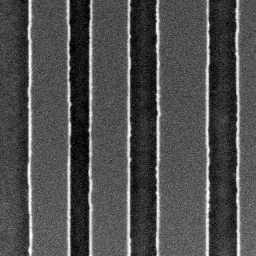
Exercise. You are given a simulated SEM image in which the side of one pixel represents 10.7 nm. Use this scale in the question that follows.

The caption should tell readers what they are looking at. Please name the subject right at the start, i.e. lines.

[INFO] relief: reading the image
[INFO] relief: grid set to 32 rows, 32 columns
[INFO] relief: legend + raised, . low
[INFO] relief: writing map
....+++++..+++++....++++++....++
....+++++..+++++....++++++....++
....+++++..+++++....++++++....++
....+++++..+++++....++++++....++
....+++++..+++++....++++++....++
....+++++..+++++....++++++....++
....+++++..+++++....++++++....++
....+++++..+++++....++++++....++
....+++++..+++++....++++++....++
....+++++..+++++....++++++....++
....+++++..+++++....++++++....++
....+++++..+++++....++++++....++
....+++++..+++++....++++++....++
....+++++..+++++....++++++....++
....+++++..+++++....++++++....++
....+++++..+++++....++++++....++
....+++++..+++++....++++++....++
....+++++..+++++....++++++....++
....+++++..+++++....++++++....++
....+++++..+++++....++++++....++
....+++++..+++++....++++++....++
....+++++..+++++....++++++....++
....+++++..+++++....++++++....++
....+++++..+++++....++++++....++
....+++++..+++++....++++++....++
....+++++..+++++....++++++....++
....+++++..+++++....++++++....++
....+++++..+++++....++++++....++
....+++++..+++++....++++++....++
....+++++..+++++....++++++....++
....+++++..+++++....++++++....++
....+++++..+++++....++++++....++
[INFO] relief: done